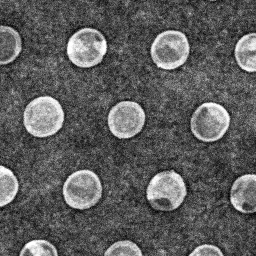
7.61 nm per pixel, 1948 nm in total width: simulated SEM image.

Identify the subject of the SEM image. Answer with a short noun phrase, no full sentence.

raised bodies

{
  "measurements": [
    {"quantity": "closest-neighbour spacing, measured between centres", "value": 620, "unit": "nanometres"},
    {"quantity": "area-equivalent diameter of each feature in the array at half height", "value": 0.282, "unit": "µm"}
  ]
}